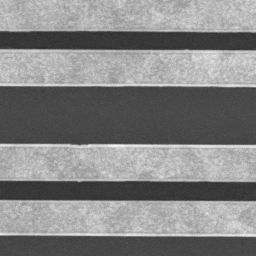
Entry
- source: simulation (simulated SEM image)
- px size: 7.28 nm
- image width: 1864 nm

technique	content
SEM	one or a few lines or trenches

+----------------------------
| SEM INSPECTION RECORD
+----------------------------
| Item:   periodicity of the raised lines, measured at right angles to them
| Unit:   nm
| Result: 546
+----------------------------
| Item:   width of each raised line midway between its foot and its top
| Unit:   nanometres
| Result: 249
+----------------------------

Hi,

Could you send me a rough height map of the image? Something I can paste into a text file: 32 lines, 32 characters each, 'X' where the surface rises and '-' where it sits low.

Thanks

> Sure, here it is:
XXXXXXXXXXXXXXXXXXXXXXXXXXXXXXXX
XXXXXXXXXXXXXXXXXXXXXXXXXXXXXXXX
XXXXXXXXXXXXXXXXXXXXXXXXXXXXXXXX
XXXXXXXXXXXXXXXXXXXXXXXXXXXXXXXX
--------------------------------
--------------------------------
XXXXXXXXXXXXXXXXXXXXXXXX--------
XXXXXXXXXXXXXXXXXXXXXXXXXXXXXXXX
XXXXXXXXXXXXXXXXXXXXXXXXXXXXXXXX
XXXXXXXXXXXXXXXXXXXXXXXXXXXXXXXX
XXXXXXXXXXXXXXXXXXXXXXXXXXXXXXXX
--------------------------------
--------------------------------
--------------------------------
--------------------------------
--------------------------------
--------------------------------
--------------------------------
XXXXXXXXXXXXXXXXXXXXXXXXXXXXXXXX
XXXXXXXXXXXXXXXXXXXXXXXXXXXXXXXX
XXXXXXXXXXXXXXXXXXXXXXXXXXXXXXXX
XXXXXXXXXXXXXXXXXXXXXXXXXXXXXXXX
---------XX---XXXXXXXXXXXXXXXXXX
--------------------------------
--------------------------------
XXXXXXXXXXXXXXXXXXXXXXXXXXXXXXXX
XXXXXXXXXXXXXXXXXXXXXXXXXXXXXXXX
XXXXXXXXXXXXXXXXXXXXXXXXXXXXXXXX
XXXXXXXXXXXXXXXXXXXXXXXXXXXXXXXX
--------------------------------
--------------------------------
--------------------------------